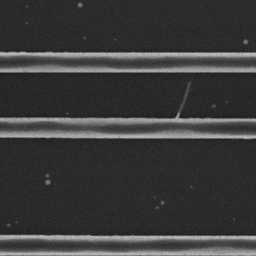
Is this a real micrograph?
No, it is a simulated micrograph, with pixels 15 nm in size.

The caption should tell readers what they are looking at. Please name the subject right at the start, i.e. lines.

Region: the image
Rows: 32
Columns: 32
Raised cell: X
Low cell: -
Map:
--------------------------------
--------------------------------
--------------------------------
--------------------------------
--------------------------------
--------------------------------
--------------------------------
XXXXXXXXXXXXXXXXXXXXXXXXXXXXXXXX
XXXXXXXXXXXXXXXXXXXXXXXXXXXXXXXX
--------------------------------
--------------------------------
--------------------------------
--------------------------------
--------------------------------
--------------------------------
XXXXXXXXXXXXXXXXXXXXXXXXXXXXXXXX
XXXXXXXXXXXXXXXXXXXXXXXXXXXXXXXX
--------------------------------
--------------------------------
--------------------------------
--------------------------------
--------------------------------
--------------------------------
--------------------------------
--------------------------------
--------------------------------
--------------------------------
--------------------------------
--------------------------------
--------------------------------
XXXXXXXXXXXXXXXXXXXXXXXXXXXXXXXX
XXXXXXXXXXXXXXXXXXXXXXXXXXXXXXXX